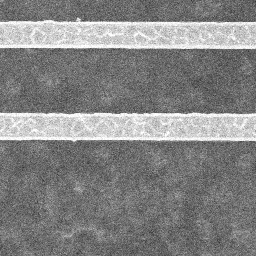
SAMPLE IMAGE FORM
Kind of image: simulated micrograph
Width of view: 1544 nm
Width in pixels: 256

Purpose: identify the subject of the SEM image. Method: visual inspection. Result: one or a few lines or trenches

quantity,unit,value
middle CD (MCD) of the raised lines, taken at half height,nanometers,145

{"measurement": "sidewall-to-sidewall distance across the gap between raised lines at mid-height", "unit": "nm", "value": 407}